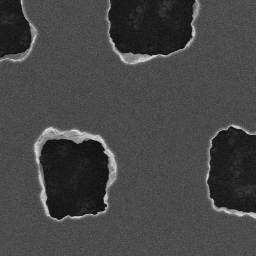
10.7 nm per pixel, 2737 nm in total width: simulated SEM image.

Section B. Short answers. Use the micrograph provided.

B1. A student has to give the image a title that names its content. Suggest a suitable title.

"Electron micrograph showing holes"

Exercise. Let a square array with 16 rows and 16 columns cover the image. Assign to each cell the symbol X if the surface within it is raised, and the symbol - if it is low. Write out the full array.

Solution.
-XXXXXX-----XXXX
--XXXXX-----XXXX
--XXXXX-----XXXX
-XXXXXXXXXXXXXXX
XXXXXXXXXXXXXXXX
XXXXXXXXXXXXXXXX
XXXXXXXXXXXXXXXX
XXXXXXXXXXXXXXXX
XXXXXXXXXXXXXX--
XX-----XXXXXX---
XX-----XXXXXX---
XXX----XXXXXX---
XXX----XXXXXX---
XXX--XXXXXXXXXXX
XXXXXXXXXXXXXXXX
XXXXXXXXXXXXXXXX